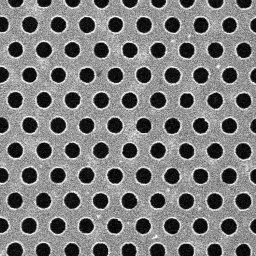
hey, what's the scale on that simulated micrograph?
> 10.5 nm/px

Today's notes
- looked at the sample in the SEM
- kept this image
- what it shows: a regular array of holes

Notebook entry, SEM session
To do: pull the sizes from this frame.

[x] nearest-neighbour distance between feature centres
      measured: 0.299 microns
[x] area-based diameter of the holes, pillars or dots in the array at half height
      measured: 0.166 microns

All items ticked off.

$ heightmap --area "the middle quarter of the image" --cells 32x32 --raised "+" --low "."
++++++++++++++++++++++++++++++++
++++...++++...++++...+++++...+++
++++....+++....+++....+++....+++
++++....+++....+++....+++....+++
+++++..+++++..+++++..+++++..++++
++++++++++++++++++++++++++++++++
++++++++++++++++++++++++++++++++
+..+++++..+++++..+++++...+++++..
....+++....++++...++++....+++...
....+++....++++...++++....+++...
+..+++++...++++...++++...++++...
++++++++++++++++++++++++++++++++
++++++++++++++++++++++++++++++++
+++++.++++++..+++++.++++++++++++
++++...++++...++++....+++....+++
.+++....+++....+++....+++....+++
++++...++++...++++....+++....+++
++++++++++++++++++++++++++++++++
++++++++++++++++++++++++++++++++
++++++++++++++++++++++++++++++++
....++++...++++...++++...++++...
....+++....++++...++++...++++...
....+++....++++...++++...++++...
++++++++..+++++..++++++.++++++..
++++++++++++++++++++++++++++++++
++++++++++++++++++++++++++++++++
++++...+++++..++++...+++++..++++
++++....+++....+++....+++....+++
++++....+++....+++....+++....+++
++++...+++++..+++++..+++++..++++
++++++++++++++++++++++++++++++++
++++++++++++++++++++++++++++++++